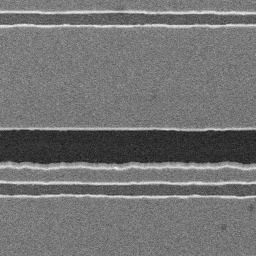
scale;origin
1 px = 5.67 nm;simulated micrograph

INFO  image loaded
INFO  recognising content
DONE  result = lines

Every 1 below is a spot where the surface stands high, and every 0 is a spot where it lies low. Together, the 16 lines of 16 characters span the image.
1111111111111111
1111111111111111
1111111111111111
1111111111111111
1111111111111111
1111111111111111
1111111111111111
1111111111111111
0000000000000000
0000000000000000
1111111111111111
1111111111111111
1111111111111111
1111111111111111
1111111111111111
1111111111111111